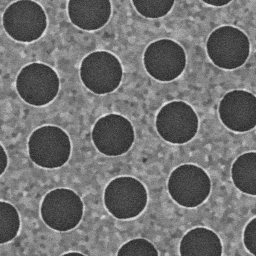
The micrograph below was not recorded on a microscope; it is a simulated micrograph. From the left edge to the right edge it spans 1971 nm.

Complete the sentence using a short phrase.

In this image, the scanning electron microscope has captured a regular array of holes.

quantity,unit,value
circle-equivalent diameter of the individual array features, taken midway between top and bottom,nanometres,336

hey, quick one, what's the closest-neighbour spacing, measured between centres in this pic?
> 492 nanometres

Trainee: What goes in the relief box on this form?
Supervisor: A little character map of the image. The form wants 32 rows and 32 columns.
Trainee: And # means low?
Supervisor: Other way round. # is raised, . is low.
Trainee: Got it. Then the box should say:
#....###......###.....####..####
#.....##......###....###########
......###.....##################
#.....####..###############...##
#....#####################.....#
###################...####.....#
############..####.....###.....#
##########.....###.....###.....#
###....###.....###.....#####..##
##.....###.....####...##########
##.....###.....#################
##.....#####..###############..#
###....#####################....
####################....###.....
#############..#####.....##.....
############....###......###....
####....###......###.....#####.#
####.....###.....####...########
####.....###....################
.###.....#####.###############..
.###....###############.#####...
######################....###...
##############...####.....###...
#############.....###.....####..
######....###......##.....######
.####.....###.....####...#######
..###.....####....##############
..###.....#####################.
..####...###############..#####.
..#####################....###..
################...###......##..
###############.....##......###.